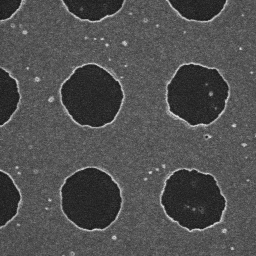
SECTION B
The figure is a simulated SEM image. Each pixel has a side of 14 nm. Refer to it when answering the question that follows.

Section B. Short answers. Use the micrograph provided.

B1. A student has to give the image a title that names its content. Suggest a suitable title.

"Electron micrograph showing holes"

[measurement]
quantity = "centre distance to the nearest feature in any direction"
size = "1430 nm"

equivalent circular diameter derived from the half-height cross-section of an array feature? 852 nanometers